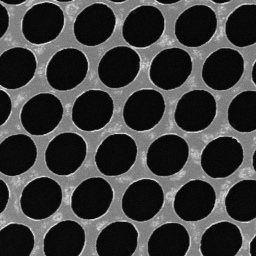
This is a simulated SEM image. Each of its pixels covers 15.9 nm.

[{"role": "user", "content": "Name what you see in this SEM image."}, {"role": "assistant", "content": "a regular array of holes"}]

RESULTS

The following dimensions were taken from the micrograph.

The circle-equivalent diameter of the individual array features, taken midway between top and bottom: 666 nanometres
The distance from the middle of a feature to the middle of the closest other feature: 784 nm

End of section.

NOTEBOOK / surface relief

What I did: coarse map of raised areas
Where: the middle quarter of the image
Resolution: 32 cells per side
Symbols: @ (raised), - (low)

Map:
------@@@----------@@@----------
------@@-----------@@-----------
------@@@----------@@-----------
-----@@@@---------@@@@---------@
----@@@@@@-------@@@@@--------@@
---@@@@@@@@----@@@@@@@@------@@@
-@@@@@@--@@@@@@@@@@----@@--@@@@@
@@@@@------@@@@@@-------@@@@@@--
@@@@--------@@@@---------@@@@---
@@@---------@@@@---------@@@----
@@----------@@@----------@@@----
@@----------@@@----------@@@----
@@----------@@@----------@@@----
@@----------@@@----------@@@----
@@---------@@@@---------@@@@----
@@@-------@@@@@@-------@@@@@@---
@@@@@---@@@@@@@@@@---@@@@@@@@@--
---@@@@@@@@@@--@@@@@@@@@@@--@@@@
-----@@@@@@------@@@@@@-------@@
-----@@@@@--------@@@@---------@
------@@@---------@@@@---------@
------@@----------@@@----------@
-----@@@----------@@@----------@
-----@@@----------@@@----------@
-----@@@----------@@@----------@
----@@@@---------@@@@---------@@
---@@@@@@-------@@@@@--------@@@
--@@@@@@@@-----@@@@@@@@----@@@@@
@@@@@@---@@@@@@@@@@@@@@@@@@@@@@@
@@@@-------@@@@@@@-----@@@@@@@@-
@@@---------@@@@--------@@@@@@--
@@@---------@@@@---------@@@@---